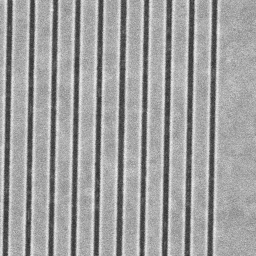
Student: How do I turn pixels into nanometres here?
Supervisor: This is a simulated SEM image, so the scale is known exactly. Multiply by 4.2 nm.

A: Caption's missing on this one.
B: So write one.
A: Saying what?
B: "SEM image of parallel lines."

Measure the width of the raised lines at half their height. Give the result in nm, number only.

65.6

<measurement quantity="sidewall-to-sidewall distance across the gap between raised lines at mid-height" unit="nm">28.9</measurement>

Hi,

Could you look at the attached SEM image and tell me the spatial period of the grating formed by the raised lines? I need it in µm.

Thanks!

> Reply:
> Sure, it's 0.0956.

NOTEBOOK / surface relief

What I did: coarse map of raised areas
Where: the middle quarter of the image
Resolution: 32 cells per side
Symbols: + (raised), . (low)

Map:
++..++++..++++..+++..++++..++++.
++..++++..++++..+++..++++..++++.
++..++++..++++..+++..++++..++++.
++..++++..++++..+++..++++..++++.
++..++++..++++..+++..++++..++++.
++..++++..+++...+++..++++..++++.
++..++++..+++...+++..++++..++++.
++..++++..+++...+++..++++..++++.
++..++++..+++...+++..++++..++++.
++..++++..+++...+++..++++..++++.
++..++++..+++...+++..++++..+++..
++..++++..+++...+++..++++..+++..
++..++++..+++...+++..++++..+++..
++..++++..+++...+++..++++..+++..
++..++++..+++...+++..++++..+++..
++..++++..+++..++++..++++..+++..
++..++++..+++..++++..++++..+++..
++..++++..+++..++++..++++..+++..
++..++++..+++..++++..++++..+++..
++..++++..+++..++++..++++..+++..
++..++++..+++..++++..++++..+++..
++..++++..+++..++++..++++..+++..
++..++++.++++..++++..++++..+++..
++..++++.++++..++++..++++..+++..
++..++++.++++..++++..++++..+++..
++..+++..++++..++++..++++..+++..
++..+++..++++..++++..++++..+++..
++..+++..++++..++++..++++..+++..
++..+++..++++..++++..++++.++++..
++..+++..++++..++++..++++.++++..
++..+++..++++..++++..++++.++++..
++..+++..++++..++++..+++..++++..